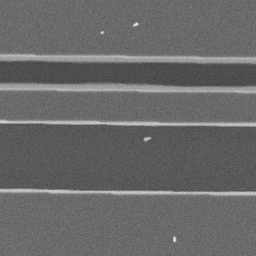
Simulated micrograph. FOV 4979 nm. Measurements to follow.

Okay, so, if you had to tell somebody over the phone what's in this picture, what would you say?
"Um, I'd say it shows lines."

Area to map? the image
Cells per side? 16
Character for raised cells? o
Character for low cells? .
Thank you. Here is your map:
oooooooooooooooo
oooooooooooooooo
oooooooooooooooo
oooooooooooooooo
................
................
oooooooooooooooo
oooooooooooooooo
................
................
................
................
oooooooooooooooo
oooooooooooooooo
oooooooooooooooo
oooooooooooooooo